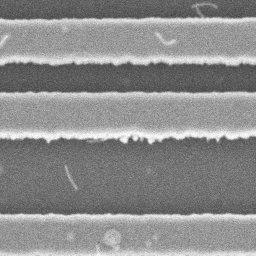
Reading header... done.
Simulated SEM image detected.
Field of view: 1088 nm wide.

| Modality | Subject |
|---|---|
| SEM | lines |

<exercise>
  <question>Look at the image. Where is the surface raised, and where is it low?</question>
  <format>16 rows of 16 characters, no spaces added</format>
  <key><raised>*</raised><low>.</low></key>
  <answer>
................
****************
****************
****************
................
................
****************
****************
..*****..*......
................
................
................
................
***********.****
****************
****************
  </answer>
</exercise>